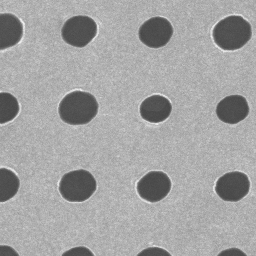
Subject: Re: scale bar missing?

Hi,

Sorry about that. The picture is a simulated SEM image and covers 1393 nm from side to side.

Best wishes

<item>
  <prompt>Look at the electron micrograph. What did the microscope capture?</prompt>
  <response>a regular array of holes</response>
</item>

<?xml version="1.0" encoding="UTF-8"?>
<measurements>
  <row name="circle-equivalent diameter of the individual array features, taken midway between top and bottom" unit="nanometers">169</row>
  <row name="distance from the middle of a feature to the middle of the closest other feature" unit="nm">416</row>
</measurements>